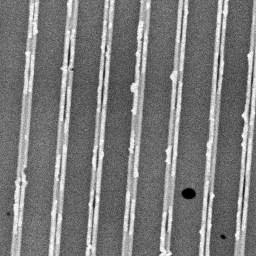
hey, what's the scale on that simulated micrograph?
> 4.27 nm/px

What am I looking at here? parallel lines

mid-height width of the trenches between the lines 122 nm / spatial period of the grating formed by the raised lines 159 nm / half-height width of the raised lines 36.2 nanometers